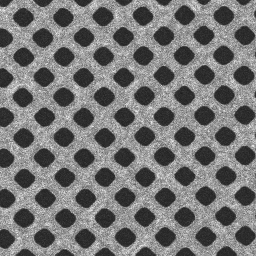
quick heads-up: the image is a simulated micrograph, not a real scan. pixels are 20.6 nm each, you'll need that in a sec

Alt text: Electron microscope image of a regular array of holes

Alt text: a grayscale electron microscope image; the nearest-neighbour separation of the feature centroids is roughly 574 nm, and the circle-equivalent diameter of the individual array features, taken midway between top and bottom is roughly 397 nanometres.